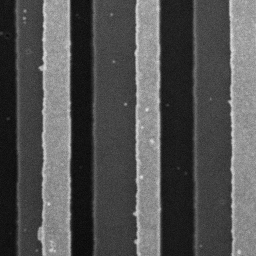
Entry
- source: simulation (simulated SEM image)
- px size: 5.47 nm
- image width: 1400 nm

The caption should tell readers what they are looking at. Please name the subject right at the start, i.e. lines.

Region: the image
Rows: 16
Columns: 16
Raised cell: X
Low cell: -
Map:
-XXX--XXXX--XXXX
-XXX--XXXX--XXXX
-XXX--XXXX--XXXX
-XXX--XXXX--XXXX
-XXX--XXXX--XXXX
-XXX--XXXX--XXXX
-XXX--XXXX--XXXX
-XXX--XXXX--XXXX
-XXX--XXXX--XXXX
-XXX--XXXX--XXXX
-XXX--XXXX--XXXX
-XXX--XXXX--XXXX
-XXX--XXXX--XXXX
-XXX--XXXX--XXXX
-XXX--XXXX--XXXX
-XXX--XXXX--XXXX